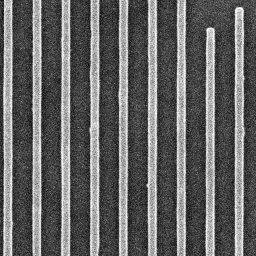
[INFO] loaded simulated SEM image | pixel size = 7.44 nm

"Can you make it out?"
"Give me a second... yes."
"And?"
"parallel lines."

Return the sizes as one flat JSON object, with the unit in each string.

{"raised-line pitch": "215 nm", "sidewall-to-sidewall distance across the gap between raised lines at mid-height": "160 nanometers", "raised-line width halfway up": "54 nm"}